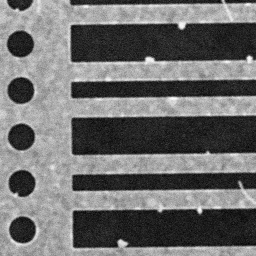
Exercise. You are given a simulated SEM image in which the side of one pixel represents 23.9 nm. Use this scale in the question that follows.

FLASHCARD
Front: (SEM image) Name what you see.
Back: groups of lines, slits or small figures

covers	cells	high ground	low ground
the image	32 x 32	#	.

#...#####..................##...
################################
################################
#########.......................
#...#####.......................
#...#####.......................
#...#####.......................
#########.........#............#
################################
################################
#...#####.......................
#...#####.......................
#...############################
################################
############....................
##.######.......................
#...#####.......................
#...#####.......................
##..#####.......................
#########....###################
################################
##..#########################...
#...#####.......................
#...#####.......................
##.#############################
################################
#########.......................
##..#####.......................
#....####.......................
#...#####.......................
##.######......#................
################################